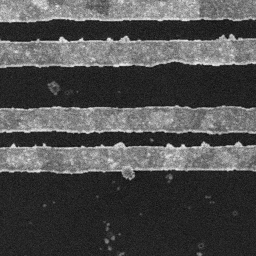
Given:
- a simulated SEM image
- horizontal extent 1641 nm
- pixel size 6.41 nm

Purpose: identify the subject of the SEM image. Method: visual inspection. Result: lines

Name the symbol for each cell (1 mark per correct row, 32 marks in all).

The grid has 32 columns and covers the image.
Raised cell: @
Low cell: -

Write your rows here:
@@@@@@@@@@@@@@@@@@@@@@@@@@@@@@@@
@@@@@@@@@@@@@@@@@@@@@@@@@@@@@@@@
@@@@@@---@@-@@---------@-----@--
--------------------------------
--------------------------------
@@@@@@@@@@@@@@@@@@@@@@@@@@@@@@@@
@@@@@@@@@@@@@@@@@@@@@@@@@@@@@@@@
@@@@@@@@@@@@@@@@@@@@@@@@@@@@@@@@
--------------------------------
--------------------------------
--------------------------------
--------------------------------
--------------------------------
------@@----------@@@@@----@@@--
@@@@@@@@@@@@@@@@@@@@@@@@@@@@@@@@
@@@@@@@@@@@@@@@@@@@@@@@@@@@@@@@@
@-------@@@@@--------@@@@@@@@@@@
--------------------------------
@@@@@@@@@@@@@@@@@@@@@@@@@@@@@@@@
@@@@@@@@@@@@@@@@@@@@@@@@@@@@@@@@
@@@@@@@@@@@@@@@@@@@@@@@@@@@@@@@@
-------@@@-----@@---------------
--------------------------------
--------------------------------
--------------------------------
--------------------------------
--------------------------------
--------------------------------
--------------------------------
--------------------------------
--------------------------------
--------------------------------